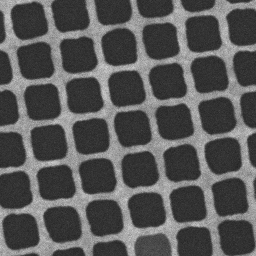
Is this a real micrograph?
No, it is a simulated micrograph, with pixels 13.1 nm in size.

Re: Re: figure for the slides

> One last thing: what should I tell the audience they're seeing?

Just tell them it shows a regular array of holes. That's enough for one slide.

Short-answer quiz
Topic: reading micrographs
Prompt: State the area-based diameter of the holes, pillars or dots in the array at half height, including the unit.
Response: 0.496 micrometres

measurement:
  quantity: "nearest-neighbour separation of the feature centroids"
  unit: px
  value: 40.8